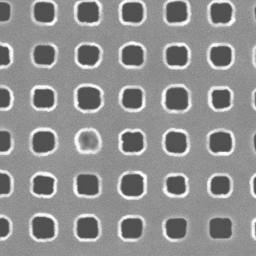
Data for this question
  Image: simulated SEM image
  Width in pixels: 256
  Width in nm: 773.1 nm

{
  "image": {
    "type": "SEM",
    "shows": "a regular array of holes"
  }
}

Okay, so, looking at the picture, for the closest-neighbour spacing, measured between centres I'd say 42.9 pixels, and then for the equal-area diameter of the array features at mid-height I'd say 66.1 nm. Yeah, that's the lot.